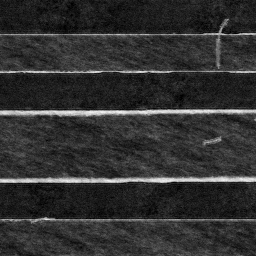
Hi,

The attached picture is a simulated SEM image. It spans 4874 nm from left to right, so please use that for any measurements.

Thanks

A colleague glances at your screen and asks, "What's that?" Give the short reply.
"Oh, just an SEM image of lines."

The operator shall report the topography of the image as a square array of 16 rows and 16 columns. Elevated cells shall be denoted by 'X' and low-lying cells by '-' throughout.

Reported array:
----------------
----------------
XXXXXXXXXXXXXXXX
XXXXXXXXXXXXXXXX
XXXXXXXXXXX---XX
----------------
----------------
XXXXXXXXXXXXXXXX
XXXXXXXXXXXXXXXX
XXXXXXXXXXXXXXXX
XXXXXXXXXXXXXXXX
----------------
----------------
----------------
XXXXXXXXXXXXXXXX
XXXXXXXXXXXXXXXX